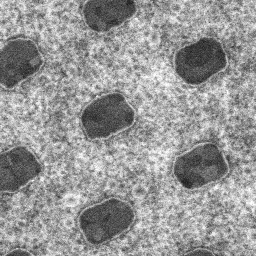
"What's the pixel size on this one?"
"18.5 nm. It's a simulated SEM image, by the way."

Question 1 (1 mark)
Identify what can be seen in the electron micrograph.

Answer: raised bodies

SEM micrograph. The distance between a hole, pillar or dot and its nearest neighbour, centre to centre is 1950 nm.